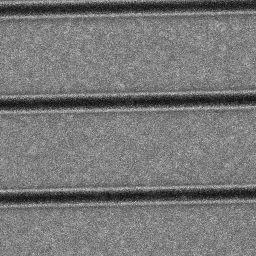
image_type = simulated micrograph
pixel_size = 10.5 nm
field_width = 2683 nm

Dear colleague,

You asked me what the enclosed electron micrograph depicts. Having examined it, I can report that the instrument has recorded one or a few lines or trenches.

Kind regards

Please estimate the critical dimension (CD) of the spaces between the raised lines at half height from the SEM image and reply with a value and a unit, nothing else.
813 nanometres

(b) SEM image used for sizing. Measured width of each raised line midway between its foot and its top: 173 nm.